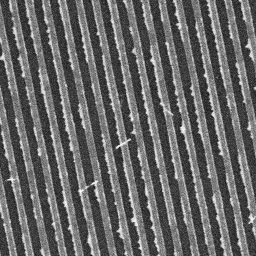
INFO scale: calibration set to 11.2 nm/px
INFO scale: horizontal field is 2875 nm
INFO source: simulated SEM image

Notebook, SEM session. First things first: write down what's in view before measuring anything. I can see parallel lines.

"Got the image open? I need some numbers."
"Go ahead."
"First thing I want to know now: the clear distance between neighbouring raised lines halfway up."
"102 nm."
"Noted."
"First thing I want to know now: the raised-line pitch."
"0.183 micrometres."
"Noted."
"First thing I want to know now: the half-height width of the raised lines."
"81.2 nm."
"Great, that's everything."